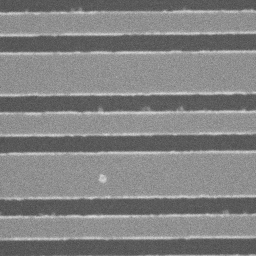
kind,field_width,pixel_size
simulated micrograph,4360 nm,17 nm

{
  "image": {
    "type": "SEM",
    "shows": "lines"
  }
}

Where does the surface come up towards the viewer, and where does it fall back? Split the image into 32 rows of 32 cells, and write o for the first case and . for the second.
................................
....................oooooooooooo
oooooooooooooooooooooooooooooooo
oooooooooooooooooooooooooooooooo
................................
................................
.....................oo.oooooooo
oooooooooooooooooooooooooooooooo
oooooooooooooooooooooooooooooooo
oooooooooooooooooooooooooooooooo
oooooooooooooooooooooooooooooooo
oooooooooooooooooooooooooooooooo
................................
................................
oooooooooooooooooooooooooooooooo
oooooooooooooooooooooooooooooooo
oooooooooooooooooooooooooooooooo
................................
................................
oooooooooooooooooooooooooooooooo
oooooooooooooooooooooooooooooooo
oooooooooooooooooooooooooooooooo
oooooooooooooooooooooooooooooooo
oooooooooooooooooooooooooooooooo
oooooooooooooooooooooooooooooooo
................................
................................
oooooooooooooooooooooooooooooooo
oooooooooooooooooooooooooooooooo
oooooooooooooooooooooooooooooooo
................................
................................